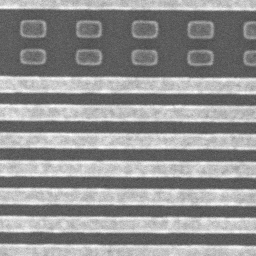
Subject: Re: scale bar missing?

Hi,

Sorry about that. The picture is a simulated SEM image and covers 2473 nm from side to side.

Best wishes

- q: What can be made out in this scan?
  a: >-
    wiring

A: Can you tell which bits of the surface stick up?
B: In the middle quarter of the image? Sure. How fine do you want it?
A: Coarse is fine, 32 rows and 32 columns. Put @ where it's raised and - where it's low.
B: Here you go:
--------------------------------
--------------------------------
--------------------------------
--------------------------------
@@@@@@@@@@@@@@@@@@@@@@@@@@@@@@@@
@@@@@@@@@@@@@@@@@@@@@@@@@@@@@@@@
@@@@@@@@@@@@@@@@@@@@@@@@@@@@@@@@
--------------------------------
--------------------------------
--------------------------------
@@@@@@@@@@@@@@@@@@@@-@@@@--@@@--
@@@@@@@@@@@@@@@@@@@@@@@@@@@@@@@@
@@@@@@@@@@@@@@@@@@@@@@@@@@@@@@@@
@@@@@@@@@@@@@@@@@@@@@@@@@@@@@@@@
--------------------------------
--------------------------------
--------------------------------
@-------------------------------
@@@@@@@@@@@@@@@@@@@@@@@@@@@@@@@@
@@@@@@@@@@@@@@@@@@@@@@@@@@@@@@@@
@@@@@@@@@@@@@@@@@@@@@@@@@@@@@@@@
--------------------------------
--------------------------------
--------------------------------
--------------------------------
@@@@@@@@@@@@@@@@@@@@@@@@@@@@@@@@
@@@@@@@@@@@@@@@@@@@@@@@@@@@@@@@@
@@@@@@@@@@@@@@@@@@@@@@@@@@@@@@@@
--------------------------------
--------------------------------
--------------------------------
@@@@@@@@@@@@@@@@@@@@@@@@@@-@@---